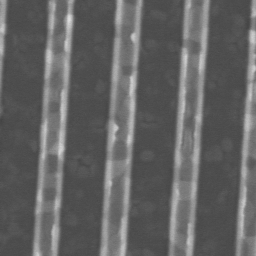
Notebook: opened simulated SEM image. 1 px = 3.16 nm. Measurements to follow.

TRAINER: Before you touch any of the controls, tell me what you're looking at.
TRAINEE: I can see one or a few lines or trenches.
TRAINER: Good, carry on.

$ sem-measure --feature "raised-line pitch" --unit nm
213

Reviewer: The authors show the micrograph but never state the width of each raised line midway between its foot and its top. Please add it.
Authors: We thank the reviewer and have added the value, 20.3 pixels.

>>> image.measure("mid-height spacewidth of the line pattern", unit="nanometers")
147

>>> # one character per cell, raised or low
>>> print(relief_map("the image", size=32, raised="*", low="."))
......***......**......***......
......***......**......***......
......***......**......***......
......***......**......***......
......***......**......***.....*
......***......**......***.....*
......***.....***......**......*
......***.....***......**......*
......**......***......**......*
......**......***......**......*
......**......***......**......*
......**......***......**......*
......**......***......**......*
......**......***......**......*
......**......***.....***......*
.....***......**......***......*
.....***......**......***......*
.....***......**......***......*
.....***......**......***......*
.....***......**......***......*
.....***......**......***.....**
.....***.....***......**......**
.....***.....***......**......**
.....**......***......**......**
.....**......***......**......**
.....**......***......**......**
.....**......***......**......**
.....**......***......**......**
.....**......***......**......**
.....**......***.....***......**
.....**......***.....***......**
....***......**......***......**